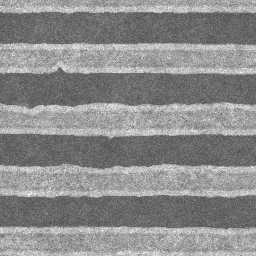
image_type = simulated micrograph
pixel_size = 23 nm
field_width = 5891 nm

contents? one or a few lines or trenches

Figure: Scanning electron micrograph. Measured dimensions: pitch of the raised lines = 1410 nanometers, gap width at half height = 863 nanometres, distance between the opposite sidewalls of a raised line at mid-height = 0.541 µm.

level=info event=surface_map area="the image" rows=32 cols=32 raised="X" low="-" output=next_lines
XXXXXXXXXXXXXXXXXXXXXXXXXXXXXXXX
--------------------------------
--------------------------------
--------------------------------
--------------------------------
--------------------------------
XXXXXXXXXXXXXXXXXXXXXXXXXXXXXXXX
XXXXXXXXXXXXXXXXXXXXXXXXXXXXXXXX
XXXXXXX-XXXXXXXXXXXXXXXXXXXXXXXX
--------------------------------
--------------------------------
--------------------------------
--------------------------------
XX---------XXXXX------X-XXXXXXXX
XXXXXXXXXXXXXXXXXXXXXXXXXXXXXXXX
XXXXXXXXXXXXXXXXXXXXXXXXXXXXXXXX
-------------XXX----X--XXXXXXXXX
--------------------------------
--------------------------------
--------------------------------
--------------------------------
XXXXXXXXXXXX--XXXXXXXXXXXXXXXXXX
XXXXXXXXXXXXXXXXXXXXXXXXXXXXXXXX
XXXXXXXXXXXXXXXXXXXXXXXXXXXXXXXX
--------------------------------
--------------------------------
--------------------------------
--------------------------------
--------------------------------
XXXXXXXXXXXXXXXXXXXXXXXXXXXXXXXX
XXXXXXXXXXXXXXXXXXXXXXXXXXXXXXXX
XXXXXXXXXXXXXXXXXXXXXXXXXXXXXXXX